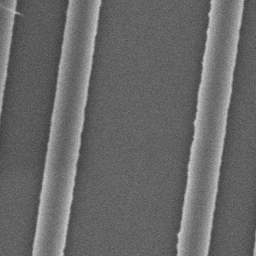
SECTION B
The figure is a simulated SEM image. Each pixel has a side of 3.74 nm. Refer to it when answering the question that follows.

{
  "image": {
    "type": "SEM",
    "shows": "lines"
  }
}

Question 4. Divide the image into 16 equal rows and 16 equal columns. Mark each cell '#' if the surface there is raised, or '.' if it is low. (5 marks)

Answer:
#...##.......##.
#...##.......##.
#...##.......##.
#...##.......##.
....##.......##.
....##......##..
...##.......##..
...##.......##..
...##.......##..
...##.......##..
...##.......##..
...##.......##..
...#........#...
..##.......##...
..##.......##...
..##.......##...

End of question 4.